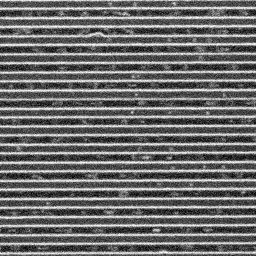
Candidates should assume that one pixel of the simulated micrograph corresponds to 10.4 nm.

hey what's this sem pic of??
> parallel lines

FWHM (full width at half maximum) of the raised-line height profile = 89.3 nm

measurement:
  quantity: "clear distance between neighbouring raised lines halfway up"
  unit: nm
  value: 97.1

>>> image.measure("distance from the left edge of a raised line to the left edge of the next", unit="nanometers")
187